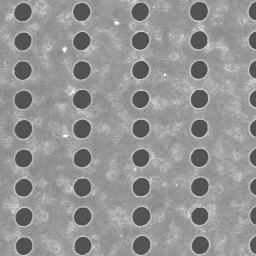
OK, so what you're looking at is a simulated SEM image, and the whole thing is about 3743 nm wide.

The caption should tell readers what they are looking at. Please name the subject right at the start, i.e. a regular array of holes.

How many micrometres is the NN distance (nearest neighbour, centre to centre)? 0.424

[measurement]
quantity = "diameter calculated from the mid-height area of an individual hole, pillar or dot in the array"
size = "261 nm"